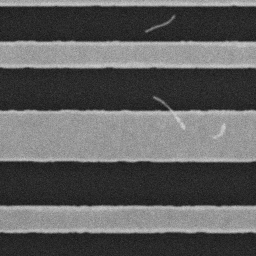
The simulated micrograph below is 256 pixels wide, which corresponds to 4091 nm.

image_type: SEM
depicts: lines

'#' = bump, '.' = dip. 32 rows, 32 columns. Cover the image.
################################
................................
................................
................................
................................
################################
################################
################################
................................
................................
................................
................................
................................
................................
################################
################################
################################
################################
################################
################################
................................
................................
................................
................................
................................
................................
################################
################################
################################
................................
................................
................................